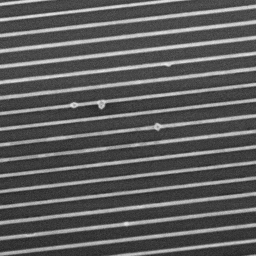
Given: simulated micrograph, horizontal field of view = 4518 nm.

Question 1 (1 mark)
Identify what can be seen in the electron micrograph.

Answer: parallel lines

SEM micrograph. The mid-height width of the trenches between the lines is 228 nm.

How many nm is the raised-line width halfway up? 46.1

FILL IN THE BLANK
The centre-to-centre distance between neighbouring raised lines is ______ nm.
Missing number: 274